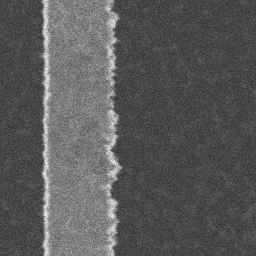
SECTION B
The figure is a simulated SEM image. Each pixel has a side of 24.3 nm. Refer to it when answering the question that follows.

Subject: one or a few lines or trenches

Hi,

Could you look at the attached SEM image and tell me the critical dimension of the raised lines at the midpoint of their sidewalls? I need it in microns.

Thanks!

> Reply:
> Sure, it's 1.6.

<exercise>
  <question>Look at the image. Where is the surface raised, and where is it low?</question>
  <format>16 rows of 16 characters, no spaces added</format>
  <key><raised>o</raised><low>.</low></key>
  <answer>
...oooo.........
...oooo.........
...oooo.........
...oooo.........
...oooo.........
...oooo.........
...oooo.........
...oooo.........
...oooo.........
...oooo.........
...oooo.........
...oooo.........
...oooo.........
...oooo.........
...oooo.........
...oooo.........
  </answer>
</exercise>